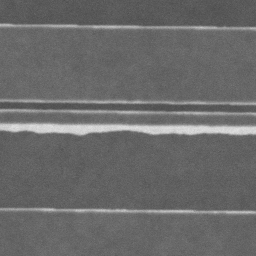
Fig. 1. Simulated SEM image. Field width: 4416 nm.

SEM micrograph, lines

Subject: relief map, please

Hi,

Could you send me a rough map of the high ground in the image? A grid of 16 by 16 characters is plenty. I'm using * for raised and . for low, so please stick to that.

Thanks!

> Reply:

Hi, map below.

................
................
****************
****************
****************
****************
****************
****************
................
................
................
................
................
****************
****************
****************